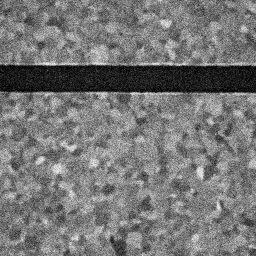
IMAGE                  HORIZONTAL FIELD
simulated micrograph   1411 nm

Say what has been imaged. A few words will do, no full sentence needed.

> one or a few lines or trenches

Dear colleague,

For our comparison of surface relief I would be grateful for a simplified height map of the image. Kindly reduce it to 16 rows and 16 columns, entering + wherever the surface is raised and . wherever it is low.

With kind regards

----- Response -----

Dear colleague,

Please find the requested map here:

++++++++++++++++
++++++++++++++++
++++++++++++++++
++++++++++++++++
................
................
++++++++++++++++
++++++++++++++++
++++++++++++++++
++++++++++++++++
++++++++++++++++
++++++++++++++++
++++++++++++++++
++++++++++++++++
++++++++++++++++
++++++++++++++++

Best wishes